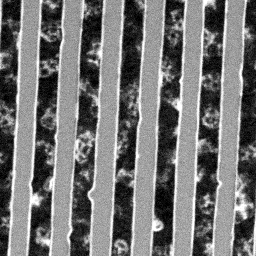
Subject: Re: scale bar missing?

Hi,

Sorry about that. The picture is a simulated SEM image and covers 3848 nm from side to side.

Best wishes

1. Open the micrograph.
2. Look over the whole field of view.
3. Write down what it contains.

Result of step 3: parallel lines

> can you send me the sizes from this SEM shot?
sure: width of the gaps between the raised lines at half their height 268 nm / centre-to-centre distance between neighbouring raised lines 610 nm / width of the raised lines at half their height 332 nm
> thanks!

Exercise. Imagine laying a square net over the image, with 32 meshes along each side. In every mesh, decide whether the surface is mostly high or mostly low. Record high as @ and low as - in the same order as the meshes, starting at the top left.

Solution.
@@@--@@@--@@@--@@@---@@---@@---@
@@@--@@@--@@@--@@@--@@@--@@@---@
@@@--@@@--@@@--@@@--@@@--@@@---@
@@@--@@@--@@@--@@@--@@@--@@@--@@
@@@--@@@--@@@--@@@--@@@--@@@--@@
@@---@@@--@@@--@@@--@@@--@@@--@@
@@---@@@--@@---@@@--@@@--@@@--@@
@@---@@---@@@--@@@--@@@--@@@--@@
@@---@@---@@@--@@@--@@@--@@@--@@
@@---@@---@@@--@@@--@@@--@@@--@@
@@---@@---@@---@@@--@@@--@@@--@@
@@---@@---@@---@@@--@@@--@@@--@@
@@---@@---@@---@@---@@@--@@@--@@
@@--@@@---@@---@@---@@@--@@@--@@
@@--@@@---@@---@@@--@@@--@@@--@@
@@--@@@---@@---@@---@@---@@@--@@
@@--@@@--@@@---@@---@@---@@@--@@
@@--@@@--@@@---@@---@@---@@@--@@
@@--@@@--@@@--@@@---@@---@@---@@
@@--@@@--@@@--@@@---@@---@@---@@
@@--@@@--@@@--@@@--@@@---@@---@@
@@--@@@--@@@--@@@--@@@--@@@---@@
@@--@@@--@@@--@@@--@@@---@@---@@
@@--@@@--@@@--@@@--@@@--@@@--@@@
@@--@@@--@@---@@@--@@@--@@@---@@
@----@@--@@@--@@@--@@@--@@@----@
@---@@@--@@@--@@@--@@@--@@@--@-@
@---@@---@@---@@@--@@@--@@@--@@@
@---@@@--@@---@@@--@@@--@@@--@@@
@---@@---@@---@@@--@@@--@@@--@@@
@--@@----@@---@@@--@@@--@@@--@@@
@--@@@---@@---@@---@@@--@@@--@@@